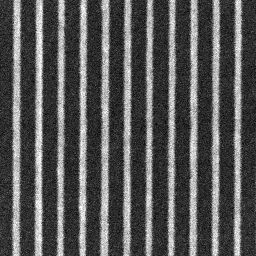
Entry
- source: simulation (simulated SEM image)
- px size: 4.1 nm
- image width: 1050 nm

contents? parallel lines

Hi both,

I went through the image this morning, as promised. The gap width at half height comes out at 68.6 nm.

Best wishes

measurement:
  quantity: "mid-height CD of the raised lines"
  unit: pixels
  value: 4.63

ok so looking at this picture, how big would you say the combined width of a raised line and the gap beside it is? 90.6 nm